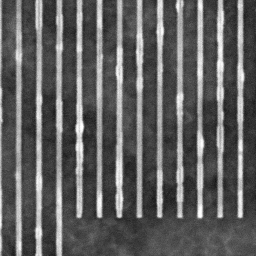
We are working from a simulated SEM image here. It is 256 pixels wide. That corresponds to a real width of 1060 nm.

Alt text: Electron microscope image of parallel lines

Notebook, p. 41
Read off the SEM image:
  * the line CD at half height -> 17.6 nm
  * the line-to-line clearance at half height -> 63.7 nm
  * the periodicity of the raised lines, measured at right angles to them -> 83.3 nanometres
